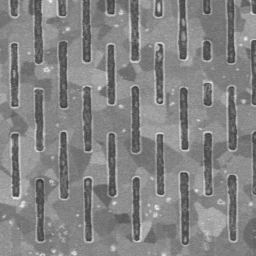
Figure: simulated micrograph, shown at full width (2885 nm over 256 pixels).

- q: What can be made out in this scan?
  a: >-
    a regular array of holes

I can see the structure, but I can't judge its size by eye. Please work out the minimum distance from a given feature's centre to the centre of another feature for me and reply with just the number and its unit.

541 nanometers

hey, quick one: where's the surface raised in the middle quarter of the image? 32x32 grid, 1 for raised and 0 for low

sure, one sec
01111111111001111111111001111111
01111111111001111111111001111111
01111111111001111111111001111111
01111111111001111111111001111111
01111111111001111111111001111111
01111011111001111111111001111111
01111001111001111001111001111001
01111001111001111001111001111001
01111001111001111001111001111001
01111001111001111001111001111001
01111001111111111001111111111001
11111001111111111001111111111001
11110001111111111001111111111001
11110001111111111001111111111001
11111001111111111001111111111001
11111001111111111001111111111001
11111001111111111001111111111001
01111001111011111001111001111001
01111001111001111001111001111001
01111001111001111001111001111001
01111001111001111001111001111001
01111001111001111001111001111111
01111111111001111111111001111111
01111111111001111111111001111111
01111111111001111111111001111111
01111111111001111111111001111111
01111111111001111111111001111111
01111111111001111111111001111001
01111001111001111001111001111001
01111001111001111001111001111001
01111001111001111001111001111001
01111001111001111001111001111001